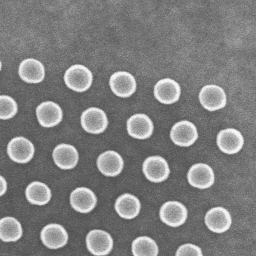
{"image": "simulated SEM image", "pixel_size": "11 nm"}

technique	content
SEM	a regular array of raised bodies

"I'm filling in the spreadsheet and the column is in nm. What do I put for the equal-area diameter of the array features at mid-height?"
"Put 274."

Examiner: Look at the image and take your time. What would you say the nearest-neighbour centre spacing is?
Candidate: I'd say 0.494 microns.